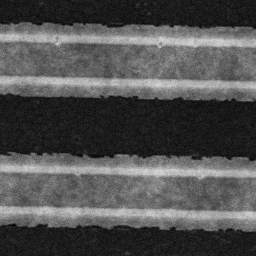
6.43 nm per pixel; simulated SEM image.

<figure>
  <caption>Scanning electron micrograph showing one or a few lines or trenches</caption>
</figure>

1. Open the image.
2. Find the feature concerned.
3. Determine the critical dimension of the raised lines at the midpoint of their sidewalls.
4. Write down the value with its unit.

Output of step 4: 274 nm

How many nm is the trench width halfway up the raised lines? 564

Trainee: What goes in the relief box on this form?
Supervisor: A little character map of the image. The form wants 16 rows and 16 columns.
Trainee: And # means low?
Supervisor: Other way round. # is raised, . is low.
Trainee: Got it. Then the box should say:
................
................
########........
################
################
................
................
................
................
................
................
################
################
................
................
................